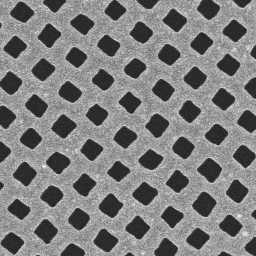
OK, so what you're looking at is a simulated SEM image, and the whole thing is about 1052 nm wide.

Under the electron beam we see a regular array of holes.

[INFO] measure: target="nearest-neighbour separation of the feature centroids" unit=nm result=141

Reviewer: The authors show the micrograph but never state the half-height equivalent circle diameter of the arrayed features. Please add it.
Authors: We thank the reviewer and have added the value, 82.8 nm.